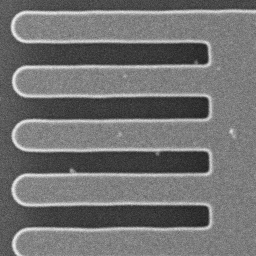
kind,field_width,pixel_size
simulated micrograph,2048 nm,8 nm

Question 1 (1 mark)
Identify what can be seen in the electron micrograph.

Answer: groups of lines, slits or small figures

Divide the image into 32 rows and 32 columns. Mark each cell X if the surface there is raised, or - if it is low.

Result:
--------------------------------
---XX-----XXXXXXXXXXXXXXXXXXXXXX
--XXXXXXXXXXXXXXXXXXXXXXXXXXXXXX
-XXXXXXXXXXXXXXXXXXXXXXXXXXXXXXX
--XXXXXXXXXXXXXXXXXXXXXXXXXXXXXX
--------------------------XXXXXX
--------------------------XXXXXX
--------------------------XXXXXX
---XXXXXXXXXXXXXXXXXXXXXXXXXXXXX
--XXXXXXXXXXXXXXXXXXXXXXXXXXXXXX
--XXXXXXXXXXXXXXXXXXXXXXXXXXXXXX
--XXXXXXXXXXXXXXXXXXXXXXXXXXXXXX
--------------------------XXXXXX
--------------------------XXXXXX
--------------------------XXXXXX
--XXXXXXXXXXXXXXXXXXXXXXXXXXXXXX
--XXXXXXXXXXXXXXXXXXXXXXXXXXXXXX
--XXXXXXXXXXXXXXXXXXXXXXXXXXXXXX
--XXXXXXXXXXXXXXXXXXXXXXXXXXXXXX
--------------------------XXXXXX
--------------------------XXXXXX
--------------------------XXXXXX
--XXXXXXXXXXXXXXXXXXXXXXXXXXXXXX
--XXXXXXXXXXXXXXXXXXXXXXXXXXXXXX
--XXXXXXXXXXXXXXXXXXXXXXXXXXXXXX
---XXXXXXXXXXXXXXXXXXXXXXXXXXXXX
--------------------------XXXXXX
--------------------------XXXXXX
-------------------------XXXXXXX
--XXXXXXXXXXXXXXXXXXXXXXXXXXXXXX
--XXXXXXXXXXXXXXXXXXXXXXXXXXXXXX
--XXXXXXXXXXXXXXXXXXXXXXXXXXXXXX